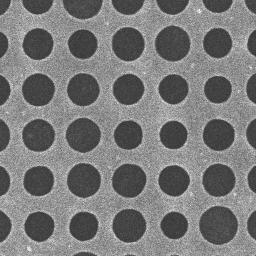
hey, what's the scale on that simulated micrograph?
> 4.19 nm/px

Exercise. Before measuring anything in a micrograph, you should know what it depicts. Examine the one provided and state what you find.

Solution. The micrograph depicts a regular array of holes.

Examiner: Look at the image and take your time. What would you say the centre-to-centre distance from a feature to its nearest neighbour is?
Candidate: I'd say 44.8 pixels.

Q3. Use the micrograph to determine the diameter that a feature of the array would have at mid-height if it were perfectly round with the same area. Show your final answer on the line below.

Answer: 131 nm